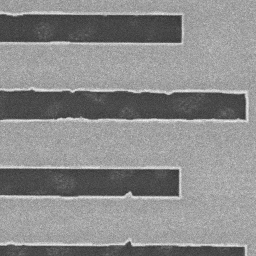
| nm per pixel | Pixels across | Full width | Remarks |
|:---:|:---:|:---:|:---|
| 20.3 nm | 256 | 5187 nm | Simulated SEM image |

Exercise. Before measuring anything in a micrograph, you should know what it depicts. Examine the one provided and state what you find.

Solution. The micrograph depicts one or a few lines or trenches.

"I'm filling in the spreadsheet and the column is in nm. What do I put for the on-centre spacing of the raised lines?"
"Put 1560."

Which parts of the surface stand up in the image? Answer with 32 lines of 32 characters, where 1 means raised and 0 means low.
11111111111111111111111111111111
11111111111111111111111111111111
00000000000000000000000111111111
00000000000000000000000111111111
00000000000000000000000111111111
11111111111100000010001111111111
11111111111111111111111111111111
11111111111111111111111111111111
11111111111111111111111111111111
11111111111111111111111111111111
11111111111111111111111111111111
00000000000000000000100000000111
00000000000000000000000000000001
00000000000000000000000000000001
00000000000000000000000000000001
11111111111111111111111111111111
11111111111111111111111111111111
11111111111111111111111111111111
11111111111111111111111111111111
11111111111111111111111111111111
11111111111111111111111111111111
00000000000000000000000111111111
00000000000000000000000111111111
00000000000000000000000111111111
00000000000000001000001111111111
11111111111111111111111111111111
11111111111111111111111111111111
11111111111111111111111111111111
11111111111111111111111111111111
11111111111111111111111111111111
00001111111111000100111111111111
00000000000000000000000000000001